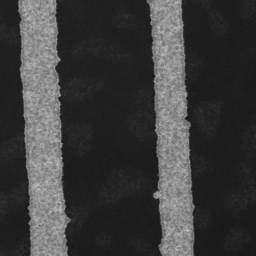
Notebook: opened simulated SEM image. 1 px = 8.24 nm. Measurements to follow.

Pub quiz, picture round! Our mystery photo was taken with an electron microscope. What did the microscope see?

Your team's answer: one or a few lines or trenches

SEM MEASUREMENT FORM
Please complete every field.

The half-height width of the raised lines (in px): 32.2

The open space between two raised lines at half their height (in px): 95.8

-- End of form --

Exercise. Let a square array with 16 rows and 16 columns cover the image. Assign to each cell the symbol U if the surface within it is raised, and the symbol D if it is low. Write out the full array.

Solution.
DUUDDDDDDUUDDDDD
DUUDDDDDDUUDDDDD
DUUUDDDDDDUDDDDD
DUUUDDDDDDUDDDDD
DUUUDDDDDDUUDDDD
DUUUDDDDDDUUDDDD
DDUUDDDDDDUUDDDD
DDUUDDDDDDUUDDDD
DDUUDDDDDDUUDDDD
DDUUDDDDDDUUDDDD
DDUUDDDDDDUUDDDD
DDUUDDDDDDUUDDDD
DDUUDDDDDDUUDDDD
DDUUDDDDDDUUDDDD
DDUUDDDDDDUUDDDD
DDUUDDDDDDUUDDDD